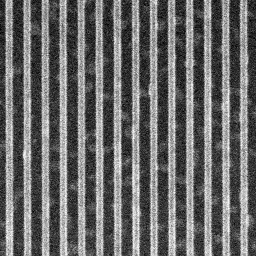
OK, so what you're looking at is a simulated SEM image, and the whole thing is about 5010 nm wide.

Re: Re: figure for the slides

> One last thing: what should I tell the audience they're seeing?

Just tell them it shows parallel lines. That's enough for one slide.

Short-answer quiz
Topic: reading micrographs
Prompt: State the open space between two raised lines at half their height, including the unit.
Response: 92.9 nm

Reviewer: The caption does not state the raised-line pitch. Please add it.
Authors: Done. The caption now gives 0.353 micrometres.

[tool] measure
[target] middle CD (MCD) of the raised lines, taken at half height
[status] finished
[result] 259 nanometres